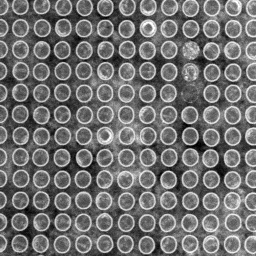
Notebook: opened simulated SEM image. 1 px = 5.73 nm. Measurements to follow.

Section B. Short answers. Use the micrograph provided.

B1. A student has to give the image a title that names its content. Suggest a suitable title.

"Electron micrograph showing a regular array of raised bodies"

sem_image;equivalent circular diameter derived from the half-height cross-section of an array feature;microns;0.0955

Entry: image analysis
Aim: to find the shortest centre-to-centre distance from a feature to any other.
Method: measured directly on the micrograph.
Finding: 120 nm